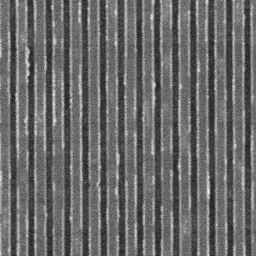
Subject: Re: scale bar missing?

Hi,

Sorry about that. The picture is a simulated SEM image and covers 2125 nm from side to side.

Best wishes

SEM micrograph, parallel lines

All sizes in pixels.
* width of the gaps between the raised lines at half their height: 7.25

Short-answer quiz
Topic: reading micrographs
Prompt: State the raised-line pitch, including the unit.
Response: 0.15 µm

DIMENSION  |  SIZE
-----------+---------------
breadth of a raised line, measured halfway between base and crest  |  0.0902 um